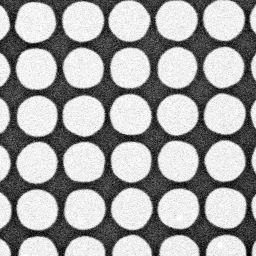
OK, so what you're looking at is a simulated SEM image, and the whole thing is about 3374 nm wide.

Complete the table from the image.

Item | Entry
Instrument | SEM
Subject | an array of small figures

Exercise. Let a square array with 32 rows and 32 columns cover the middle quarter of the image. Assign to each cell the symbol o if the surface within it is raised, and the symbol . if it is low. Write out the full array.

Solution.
oooooooooo..ooooooooo...oooooooo
oooooooooo..ooooooooo...oooooooo
oooooooooo..ooooooooo...oooooooo
.oooooooo...ooooooooo...oooooooo
.oooooooo....ooooooo.....ooooooo
...oooo.......ooooo.......oooo..
................................
................................
...oooo.......ooooo.......ooooo.
.oooooooo....ooooooo....oooooooo
ooooooooo...ooooooooo...oooooooo
oooooooooo..ooooooooo...oooooooo
oooooooooo..oooooooooo.ooooooooo
oooooooooo..oooooooooo.ooooooooo
oooooooooo..oooooooooo..oooooooo
ooooooooo...ooooooooo....ooooooo
.oooooooo....ooooooo.....ooooooo
...oooo.........oo........ooo...
................................
...........................oo...
..oooooo.....ooooooo.....ooooooo
.oooooooo....oooooooo...oooooooo
oooooooooo..oooooooooo..oooooooo
oooooooooo..oooooooooo..oooooooo
oooooooooo..oooooooooo..oooooooo
oooooooooo..oooooooooo..oooooooo
oooooooooo..ooooooooo...oooooooo
.oooooooo....oooooooo....ooooooo
..oooooo......oooooo......oooooo
................................
................................
....oo.........oooo........ooo..